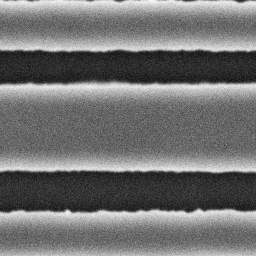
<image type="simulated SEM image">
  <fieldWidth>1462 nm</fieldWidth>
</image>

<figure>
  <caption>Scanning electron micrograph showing lines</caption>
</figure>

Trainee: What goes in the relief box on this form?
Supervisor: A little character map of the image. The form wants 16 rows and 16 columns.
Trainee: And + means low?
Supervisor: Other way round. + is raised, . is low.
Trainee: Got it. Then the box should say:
++++++++++++++++
++++++++++++++++
++++++++++++++++
................
................
++++++++++++++++
++++++++++++++++
++++++++++++++++
++++++++++++++++
++++++++++++++++
++++++++++++++++
................
................
++++++++++++++++
++++++++++++++++
++++++++++++++++